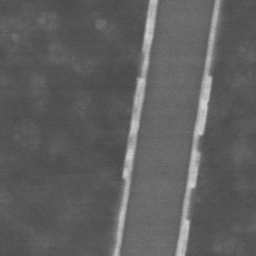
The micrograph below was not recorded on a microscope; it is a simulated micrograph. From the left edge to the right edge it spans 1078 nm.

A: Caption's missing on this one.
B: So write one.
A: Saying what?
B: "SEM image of one or a few lines or trenches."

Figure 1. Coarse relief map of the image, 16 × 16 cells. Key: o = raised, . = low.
oooooooooo....oo
oooooooooo...ooo
ooooooooo....ooo
ooooooooo....ooo
ooooooooo....ooo
ooooooooo....ooo
ooooooooo....ooo
ooooooooo...oooo
oooooooo....oooo
oooooooo....oooo
oooooooo....oooo
oooooooo....oooo
oooooooo....oooo
oooooooo...ooooo
oooooooo...ooooo
ooooooo....ooooo